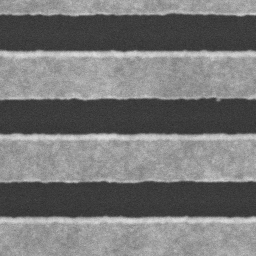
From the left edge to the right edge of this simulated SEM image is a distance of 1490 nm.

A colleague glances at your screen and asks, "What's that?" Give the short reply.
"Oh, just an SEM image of lines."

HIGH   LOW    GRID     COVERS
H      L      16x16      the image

HHHHHHHHHHHHHHHH
LLLLLLLLLLLLLLLL
LLLLLLLLLLLLLLLL
HHHHHHHHHHHHHHHH
HHHHHHHHHHHHHHHH
HHHHHHHHHHHHHHHH
LLLLLLLLLLLLLLLL
LLLLLLLLLLLLLLLL
HHHLLHHHHHHLHHHH
HHHHHHHHHHHHHHHH
HHHHHHHHHHHHHHHH
LLLLLLLLLLLLLLLL
LLLLLLLLLLLLLLLL
LLLLLLLLLLLLLLLL
HHHHHHHHHHHHHHHH
HHHHHHHHHHHHHHHH